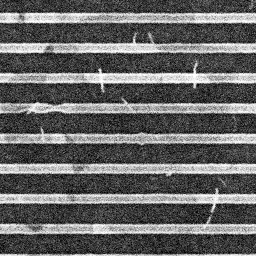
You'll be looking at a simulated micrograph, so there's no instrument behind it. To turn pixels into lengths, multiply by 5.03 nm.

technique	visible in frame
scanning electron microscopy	parallel lines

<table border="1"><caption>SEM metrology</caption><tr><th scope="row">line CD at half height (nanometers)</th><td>35.8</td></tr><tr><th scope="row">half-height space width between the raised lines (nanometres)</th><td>116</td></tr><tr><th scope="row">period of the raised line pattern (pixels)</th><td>30.2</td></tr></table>